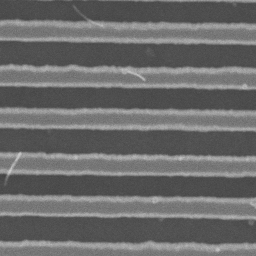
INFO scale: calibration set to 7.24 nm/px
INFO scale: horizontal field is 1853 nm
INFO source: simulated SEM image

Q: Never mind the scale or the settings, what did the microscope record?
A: lines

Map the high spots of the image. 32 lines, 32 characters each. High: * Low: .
................................
................................
................................
********************************
********************************
...............................*
................................
................................
*********************.**********
********************************
********************************
................................
................................
***.............................
********************************
********************************
................................
................................
................................
*********************.**..*.....
********************************
********************************
................................
................................
****.****.......................
********************************
********************************
................................
................................
................................
**************************..****
********************************